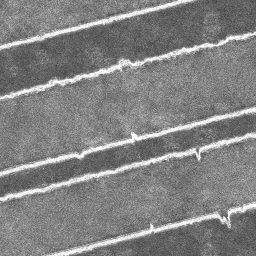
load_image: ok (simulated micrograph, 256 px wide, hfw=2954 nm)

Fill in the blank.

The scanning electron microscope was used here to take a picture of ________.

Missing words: one or a few lines or trenches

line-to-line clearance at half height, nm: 827